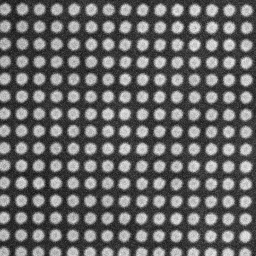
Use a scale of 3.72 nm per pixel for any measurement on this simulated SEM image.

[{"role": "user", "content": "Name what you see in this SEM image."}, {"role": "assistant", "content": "a regular array of raised bodies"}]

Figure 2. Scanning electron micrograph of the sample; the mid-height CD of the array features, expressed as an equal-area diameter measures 40.1 nm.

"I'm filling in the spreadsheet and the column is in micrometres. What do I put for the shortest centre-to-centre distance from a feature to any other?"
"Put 0.0635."